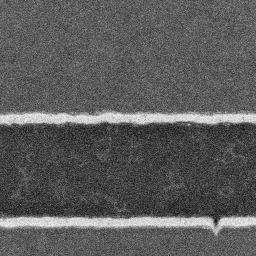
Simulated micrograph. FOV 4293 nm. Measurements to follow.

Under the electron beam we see one or a few lines or trenches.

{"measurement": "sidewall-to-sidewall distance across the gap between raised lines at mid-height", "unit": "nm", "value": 1740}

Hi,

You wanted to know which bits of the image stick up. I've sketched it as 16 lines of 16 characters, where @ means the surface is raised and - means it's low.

@@@@@@@@@@@@@@@@
@@@@@@@@@@@@@@@@
@@@@@@@@@@@@@@@@
@@@@@@@@@@@@@@@@
@@@@@@@@@@@@@@@@
@@@@@@@@@@@@@@@@
@@@@@@@@@@@@@@@@
----------------
----------------
----------------
----------------
----------------
----------------
----------------
@@@@@@@@@@@@@@@@
@@@@@@@@@@@@@@@@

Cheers